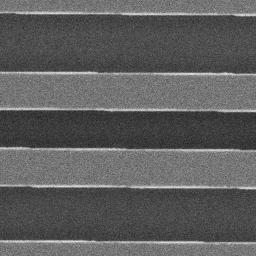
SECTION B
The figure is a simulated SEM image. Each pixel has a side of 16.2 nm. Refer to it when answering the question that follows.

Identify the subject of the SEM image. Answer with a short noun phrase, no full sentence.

lines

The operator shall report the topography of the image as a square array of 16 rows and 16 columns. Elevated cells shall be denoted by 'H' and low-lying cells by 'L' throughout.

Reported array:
HHHHHHHHHHHHHHHH
LLLLLLLLLLLLLLLL
LLLLLLLLLLLLLLLL
LLLLLLLLLLLLLLLL
LLLLLLLLLLLLLLLL
HHHHHHHHHHHHHHHH
HHHHHHHHHHHHHHHH
LLLLLLLLLLLLLLLL
LLLLLLLLLLLLLLLL
HHHHHHHHHHHHHHHH
HHHHHHHHHHHHHHHH
HHHHHHHHHHHHHHHH
LLLLLLLLLLLLLLLL
LLLLLLLLLLLLLLLL
LLLLLLLLLLLLLLLL
HHHHHHHHHHHHHHHH